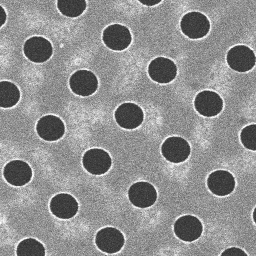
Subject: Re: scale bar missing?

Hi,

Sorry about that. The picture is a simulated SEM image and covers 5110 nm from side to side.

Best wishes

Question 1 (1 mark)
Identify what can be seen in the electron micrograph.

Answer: a regular array of holes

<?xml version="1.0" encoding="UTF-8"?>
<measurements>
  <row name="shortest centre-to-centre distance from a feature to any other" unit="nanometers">1120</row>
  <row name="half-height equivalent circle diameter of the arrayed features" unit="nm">561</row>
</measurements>